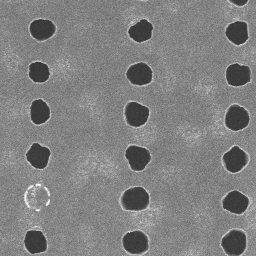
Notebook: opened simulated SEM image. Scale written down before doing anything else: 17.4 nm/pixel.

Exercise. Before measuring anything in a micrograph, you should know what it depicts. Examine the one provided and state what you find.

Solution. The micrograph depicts a regular array of holes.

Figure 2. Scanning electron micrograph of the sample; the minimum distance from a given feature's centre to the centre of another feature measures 719 nm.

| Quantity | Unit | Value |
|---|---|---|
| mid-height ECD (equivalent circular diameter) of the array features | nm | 406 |